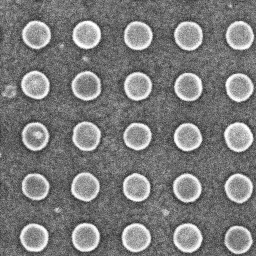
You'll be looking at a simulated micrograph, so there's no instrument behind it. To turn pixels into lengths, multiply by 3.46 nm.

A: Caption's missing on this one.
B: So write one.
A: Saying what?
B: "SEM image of a regular array of raised bodies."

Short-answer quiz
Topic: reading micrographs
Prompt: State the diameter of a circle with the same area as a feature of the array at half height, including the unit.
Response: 27.2 px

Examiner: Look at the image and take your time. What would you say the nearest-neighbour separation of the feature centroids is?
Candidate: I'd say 0.174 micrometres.